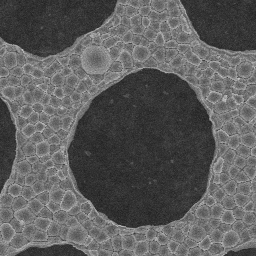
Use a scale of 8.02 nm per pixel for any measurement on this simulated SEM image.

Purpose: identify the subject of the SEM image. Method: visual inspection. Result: holes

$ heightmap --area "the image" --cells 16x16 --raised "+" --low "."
.......+++++....
......++++++....
.....++++++++...
++.+++++++++++++
++++++++..++++++
+++++++.....++++
++++++.......+++
.++++........+++
.++++........+++
.+++.........+++
.+++.........+++
+++++........+++
+++++.......++++
++++++.....+++++
++++++++++++++++
++...++++++++++.